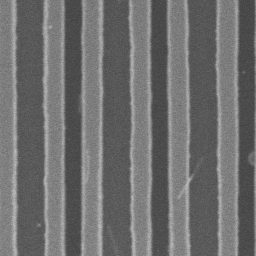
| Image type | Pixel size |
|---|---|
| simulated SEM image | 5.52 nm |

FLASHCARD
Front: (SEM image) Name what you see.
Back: lines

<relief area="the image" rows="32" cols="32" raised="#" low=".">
##....##..###...###..##....###..
##...###..###...###..##....###..
##...###..###...###..##....###..
##...###..###...###..##....###..
##...###..###...###..##....###..
##...###..###...###..##....###..
##....##..###...###..##....###..
##...###..###...###..##....###..
##...###..###...###..###...###..
##...###..###...###..###...###..
##...###..###...###..###...###..
##...###..###...###..###...###..
##...###..###...###..###...###..
##...###..###...###..###...###..
##...###..###...###..###...###..
##....##..###...###..###...###..
##....##..###...###..###...###..
##....##..###...###..###...###..
##....##..###...###..###...###..
##....##..###...###..###...###..
##....##..###...###..###...###..
##....##..###...###..###...###..
##...###..###...###..###...###..
##....##..###...###..###...###..
##....##..###...###..###...###..
##....##..###...###..###...###..
##....##..###...###..###...###..
##....##..###...###..###...###..
##....##..###...###..###...###..
##....##..###....##..###...###..
##....##..###....##..###...###..
##....##..###....##..###...###..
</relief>